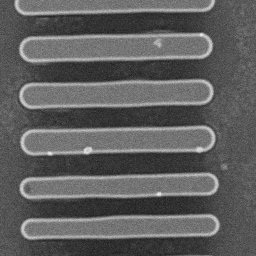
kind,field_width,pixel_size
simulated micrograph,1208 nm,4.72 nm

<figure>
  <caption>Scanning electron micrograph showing groups of lines, slits or small figures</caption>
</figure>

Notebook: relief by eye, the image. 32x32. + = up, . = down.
..+++++++++++++++++++++++++.....
...++++++++++++.................
................................
................................
...........+++++++++++++++......
...+++++++++++++++++++++++......
...+++++++++++++++++++++++......
...++++++++++...................
................................
................................
...........+++++++++++++++......
...++++++++++++++++++++++++.....
...+++++++++++++++++++++++......
....+...........................
................................
................................
....+++++++++++++++++++++++.....
...++++++++++++++++++++++++.....
...+++++++++++++++++++++++......
................................
................................
................................
...++++++++++++++++++++++++.....
...++++++++++++++++++++++++.....
...++++++++++++++++.............
................................
................................
....+++++++++++++++++++++++.....
...++++++++++++++++++++++++.....
...+++++++++++++++++++++........
................................
................................